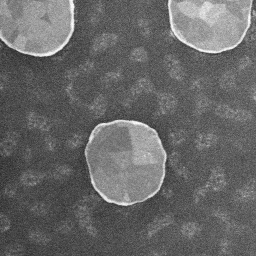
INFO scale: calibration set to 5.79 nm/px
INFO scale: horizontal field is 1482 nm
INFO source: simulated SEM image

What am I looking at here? raised bodies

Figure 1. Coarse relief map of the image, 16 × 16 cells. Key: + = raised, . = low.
+++++......+++++
+++++......+++++
++++.......++++.
................
................
................
................
................
......++++......
.....+++++......
......++++......
......++++......
.......++.......
................
................
................